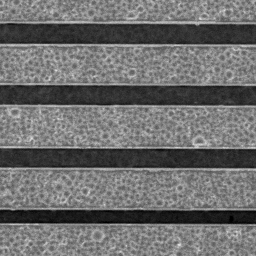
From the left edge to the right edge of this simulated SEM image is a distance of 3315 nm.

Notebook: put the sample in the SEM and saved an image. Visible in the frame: one or a few lines or trenches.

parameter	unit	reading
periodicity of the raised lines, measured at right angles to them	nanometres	805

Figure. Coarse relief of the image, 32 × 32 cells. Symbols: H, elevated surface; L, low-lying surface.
HHHHHHHHHHHHHHHHHHHHHHHHHHHHHHHH
HHHHHHHHHHHHHHHHHHHHHHHHHHHHHHHH
HHHHHHHHHHHHHHHHHHHHHHHHHHHHHHHH
LLLLLLLLLLLLLLLLLLLLLLLLLLLLLLLL
LLLLLLLLLLLLLLLLLLLLLLLLLLLLLLLL
LLLLLLLLLLLLLLLLLLLLLLLLLLLLLLLL
HHHHHHHHHHHHHHHHHHHHHHHHHHHHHHHH
HHHHHHHHHHHHHHHHHHHHHHHHHHHHHHHH
HHHHHHHHHHHHHHHHHHHHHHHHHHHHHHHH
HHHHHHHHHHHHHHHHHHHHHHHHHHHHHHHH
LLLLLLLLLLLLLLLHHHHHHHHHHHHHHHHH
LLLLLLLLLLLLLLLLLLLLLLLLLLLLLLLL
LLLLLLLLLLLLLLLLLLLLLLLLLLLLLLLL
HHHHHHHHHHHHHHHHHHHHHHHHHHHHHHHH
HHHHHHHHHHHHHHHHHHHHHHHHHHHHHHHH
HHHHHHHHHHHHHHHHHHHHHHHHHHHHHHHH
HHHHHHHHHHHHHHHHHHHHHHHHHHHHHHHH
HHHHHHHHHHHHHHHHHHHHHHHHHHHHHHHH
LLLLLLLLLLHLLLLLLLLLLLLLLLLLLLLL
LLLLLLLLLLLLLLLLLLLLLLLLLLLLLLLL
LLLLLLLLLLLLLLLLLLLLLLLLLLLLLLLL
HHHHHHHHHHHHHHHHHHHHHHHHHHHHHHHH
HHHHHHHHHHHHHHHHHHHHHHHHHHHHHHHH
HHHHHHHHHHHHHHHHHHHHHHHHHHHHHHHH
HHHHHHHHHHHHHHHHHHHHHHHHHHHHHHHH
HHHHHHHHHHHHHHHHHHHHHHHHHHHHHHHH
LLLLLLLLLLLLLLLLLLLLLLLLLLLLLLLL
LLLLLLLLLLLLLLLLLLLLLLLLLLLLLLLL
HHHHHHHHHHHHHHHHHHHHHHHHHHHHHHHH
HHHHHHHHHHHHHHHHHHHHHHHHHHHHHHHH
HHHHHHHHHHHHHHHHHHHHHHHHHHHHHHHH
HHHHHHHHHHHHHHHHHHHHHHHHHHHHHHHH